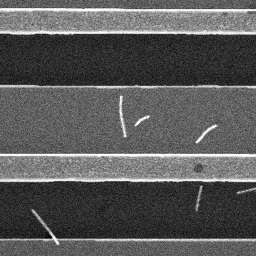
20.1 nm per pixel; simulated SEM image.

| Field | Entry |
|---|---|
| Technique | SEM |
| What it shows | lines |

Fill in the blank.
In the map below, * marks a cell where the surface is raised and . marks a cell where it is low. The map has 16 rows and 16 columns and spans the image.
****************
****************
................
................
................
****************
****************
****************
****************
****************
****************
................
................
................
................
****************